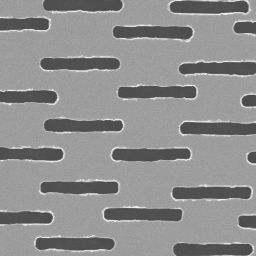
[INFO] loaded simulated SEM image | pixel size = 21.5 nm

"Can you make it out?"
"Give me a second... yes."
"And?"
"a regular array of holes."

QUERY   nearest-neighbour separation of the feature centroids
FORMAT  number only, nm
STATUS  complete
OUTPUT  1290